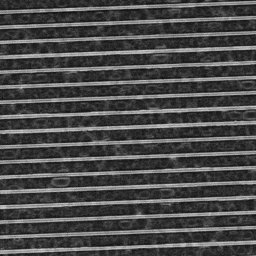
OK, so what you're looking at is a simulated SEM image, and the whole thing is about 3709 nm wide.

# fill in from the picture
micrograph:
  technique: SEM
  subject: parallel lines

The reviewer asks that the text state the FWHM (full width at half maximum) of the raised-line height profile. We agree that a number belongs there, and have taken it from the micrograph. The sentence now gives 2.37 pixels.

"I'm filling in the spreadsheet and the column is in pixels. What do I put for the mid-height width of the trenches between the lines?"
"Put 12.7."